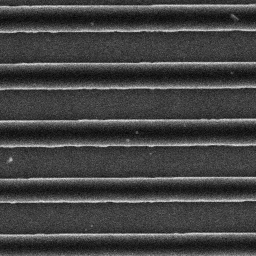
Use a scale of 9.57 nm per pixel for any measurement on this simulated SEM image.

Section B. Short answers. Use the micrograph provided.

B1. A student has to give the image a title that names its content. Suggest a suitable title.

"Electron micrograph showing lines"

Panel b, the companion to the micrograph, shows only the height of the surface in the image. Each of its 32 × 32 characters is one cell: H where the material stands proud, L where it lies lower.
LLLLLLLLLLLLLLLLLLLLLLLLLLLLLLLL
HHHHHHHHHHHHHHHHHHHHHHHHHHHHHHHH
HHHHHHHHHHHHHHHHHHHHHHHHHHHHHHHH
HHHHHHHHHHHHHHHHHHHHHHHHHHHHHHHH
LLLLLLLLLLLLLLLLLLLLLLLLLLLLLLLL
LLLLLLLLLLLLLLLLLLLLLLLLLLLLLLLL
LLLLLLLLLLLLLLLLLLLLLLLLLLLLLLLL
LLLLLLLLLLLLLLLLLLLLLLLLLLLLLLLL
HHHHHHHHHHHHHHHHHHHHHHHHHHHHHHHH
HHHHHHHHHHHHHHHHHHHHHHHHHHHHHHHH
HHHHHHHHHHHHHHHHHHHHHHHHHHHHHHHH
LLLLLLLLLLLLLLLLLLLLLLLLLLLLLLLL
LLLLLLLLLLLLLLLLLLLLLLLLLLLLLLLL
LLLLLLLLLLLLLLLLLLLLLLLLLLLLLLLL
LLLLLLLLLLLLLLLLLLLLLLLLLLLLLLLL
HHHHHHHHHHHHHHHHHHHHHHHHHHHHHHHH
HHHHHHHHHHHHHHHHHHHHHHHHHHHHHHHH
HHHHHHHHHHHHHHHHHHHHHHHHHHHHHHHH
LLLLLLLLLLLLLLLLLLLLLLLLLLLLLLLL
LLLLLLLLLLLLLLLLLLLLLLLLLLLLLLLL
LLLLLLLLLLLLLLLLLLLLLLLLLLLLLLLL
LLLLLLLLLLLLLLLLLLLLLLLLLLLLLLLL
HHHHHHHHHHHHHHHHHHHHHHHHHHHHHHHH
HHHHHHHHHHHHHHHHHHHHHHHHHHHHHHHH
HHHHHHHHHHHHHHHHHHHHHHHHHHHHHHHH
LLLLLLLLLLLLLLLLLLLLLLLLLLLLLLLL
LLLLLLLLLLLLLLLLLLLLLLLLLLLLLLLL
LLLLLLLLLLLLLLLLLLLLLLLLLLLLLLLL
LLLLLLLLLLLLLLLLLLLLLLLLLLLLLLLL
HHHHHHHHHHHHHHHHHHHHHHHHHHHHHHHH
HHHHHHHHHHHHHHHHHHHHHHHHHHHHHHHH
HHHHHHHHHHHHHHHHHHHHHHHHHHHHHHHH